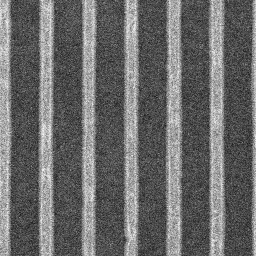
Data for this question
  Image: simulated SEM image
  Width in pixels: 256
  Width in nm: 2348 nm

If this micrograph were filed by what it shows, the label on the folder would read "parallel lines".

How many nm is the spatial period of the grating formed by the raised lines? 391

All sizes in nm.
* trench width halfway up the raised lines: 288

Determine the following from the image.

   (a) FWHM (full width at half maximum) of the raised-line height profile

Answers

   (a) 0.102 micrometres